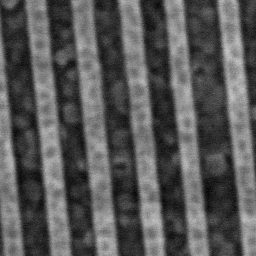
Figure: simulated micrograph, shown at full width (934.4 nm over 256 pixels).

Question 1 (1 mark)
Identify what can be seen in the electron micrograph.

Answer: parallel lines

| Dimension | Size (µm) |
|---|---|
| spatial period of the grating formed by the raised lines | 0.172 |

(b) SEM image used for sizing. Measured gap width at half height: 104 nm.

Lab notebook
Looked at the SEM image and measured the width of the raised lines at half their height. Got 0.064 um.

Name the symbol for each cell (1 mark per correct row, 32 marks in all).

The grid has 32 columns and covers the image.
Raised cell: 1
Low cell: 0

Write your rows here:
00011100011000011000011000011100
00001100011100011000011000011100
00001100011100011100011000001100
00001100011100011100011000001100
00001100011100001100011000001100
00001100001100001100011000001100
00001100001100001100011000001100
00001100001100001100011000001100
00001100001100001100001100001100
10001100001100001100001100001110
10001110001100001100001100001110
10000110001110001100001100000110
10000110001110001110001100000110
10000110001110001110001100000110
10000110001110001110001100000110
10000110000110000110001100000110
10000110000110000110001100000110
10000110000110000110001100000110
10000110000110000110000110000110
11000111000110000110000110000111
11000111000110000110000110000111
11000011000111000110000110000011
11000011000111000111000110000011
11000011000111000111000110000011
11000011000011000011000110000011
11000011000011000011000110000011
11000011000011000011000110000011
11000011000011000011000110000011
11000011000011000011000011000011
01100011000011000011000011000011
01100001100011000011000011000011
01100001100011100011000011000001